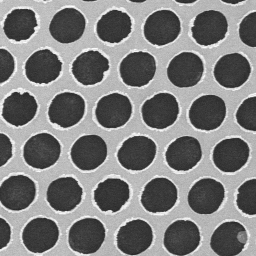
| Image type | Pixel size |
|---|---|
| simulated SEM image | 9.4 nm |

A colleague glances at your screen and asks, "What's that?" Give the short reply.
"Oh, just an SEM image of a regular array of holes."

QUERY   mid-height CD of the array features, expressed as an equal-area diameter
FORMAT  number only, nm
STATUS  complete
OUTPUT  337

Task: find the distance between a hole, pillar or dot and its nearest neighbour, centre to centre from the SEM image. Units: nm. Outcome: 442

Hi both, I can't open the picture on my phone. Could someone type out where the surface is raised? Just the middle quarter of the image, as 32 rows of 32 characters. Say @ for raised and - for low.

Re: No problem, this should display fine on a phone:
@@---------@@@---------@@@------
@@---------@@@---------@@@------
@@--------@@@@---------@@@------
@@@-------@@@@--------@@@@------
@@@@-----@@@@@@------@@@@@@-----
@@@@@@@@@@@@@@@@@---@@@@@@@@----
@@@@@@@@@@@@@@@@@@@@@@@@@@@@@@@@
---@@@@@@@@@--@@@@@@@@@---@@@@@@
-----@@@@-------@@@@@@------@@@@
-----@@@---------@@@--------@@@@
-----@@@---------@@@---------@@@
-----@@@---------@@----------@@-
-----@@@---------@@----------@@-
-----@@@--------@@@@--------@@@-
----@@@@@-------@@@@--------@@@@
--@@@@@@@@-----@@@@@@-----@@@@@@
@@@@@@@@@@@@@@@@@@@@@@@@@@@@@@@@
@@@@@@@@@@@@@@@@@@@@@@@@@@@@@@@@
@@@@-----@@@@@@@@----@@@@@@@@---
@@@-------@@@@@-------@@@@@-----
@@---------@@@---------@@@------
@@---------@@@---------@@@------
@@---------@@----------@@-------
@@--------@@@----------@@-------
@@--------@@@@--------@@@@------
@@@------@@@@@-------@@@@@------
@@@@@--@@@@@@@@@@--@@@@@@@@@---@
@@@@@@@@@@@@@@@@@@@@@@@@@@@@@@@@
--@@@@@@@@@-@@@@@@@@@@@--@@@@@@@
---@@@@@@@-----@@@@@@------@@@@@
----@@@@--------@@@@--------@@@@
-----@@@--------@@@@--------@@@-